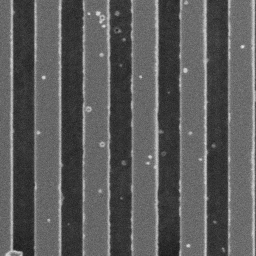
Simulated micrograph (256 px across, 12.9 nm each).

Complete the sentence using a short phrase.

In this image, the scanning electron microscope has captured lines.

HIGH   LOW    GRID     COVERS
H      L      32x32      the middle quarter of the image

LLLLLHHHHHHLLLLLLHHHHHHLLLLLLHHH
LLLLLHHHHHHLLLLLLHHHHHHLLLLLLHHH
LLLLLHHHHHHLLLLLLHHHHHHLLLLLLHHH
LLLLLHHHHHHLLLLLLHHHHHHLLLLLLHHH
LLLLLHHHHHHLLLLLLHHHHHHLLLLLLHHH
LLLLLHHHHHHLLLLLLHHHHHHLLLLLLHHH
LLLLLHHHHHHLLLLLLHHHHHHLLLLLLHHH
LLLLLHHHHHHLLLLLLHHHHHHLLLLLLHHH
LLLLLHHHHHHLLLLLLHHHHHHLLLLLLHHH
LLLLLHHHHHHLLLLLLHHHHHHLLLLLLHHH
LLLLLHHHHHHLLLLLLHHHHHHLLLLLLHHH
LLLLLHHHHHHLLLLLLHHHHHHLLLLLLHHH
LLLLLHHHHHHLLLLLLHHHHHHLLLLLLHHH
LLLLLHHHHHHLLLLLLHHHHHHLLLLLLHHH
LLLLLHHHHHHLLLLLLHHHHHHLLLLLLHHH
LLLLLHHHHHHLLLLLLHHHHHHLLLLLLHHH
LLLLLHHHHHHLLLLLLHHHHHHLLLLLLHHH
LLLLLHHHHHHLLLLLLHHHHHHLLLLLLHHH
LLLLLHHHHHHLLLLLLHHHHHHLLLLLLHHH
LLLLLHHHHHHLLLLLLHHHHHHLLLLLLHHH
LLLLLHHHHHHLLLLLLHHHHHHLLLLLLHHH
LLLLLHHHHHHLLLLLLHHHHHHLLLLLLHHH
LLLLLHHHHHHLLLLLLHHHHHHLLLLLLHHH
LLLLLHHHHHHLLLLLLHHHHHHLLLLLLHHH
LLLLLHHHHHHLLLLLLHHHHHHLLLLLLHHH
LLLLLHHHHHHLLLLLLHHHHHHLLLLLLHHH
LLLLLHHHHHHLLLLLLHHHHHHLLLLLLHHH
LLLLLHHHHHHLLLLLLHHHHHHLLLLLLHHH
LLLLLHHHHHHLLLLLLHHHHHHLLLLLLHHH
LLLLLHHHHHHLLLLLLHHHHHHLLLLLLHHH
LLLLLHHHHHHLLLLLLHHHHHHLLLLLLHHH
LLLLLHHHHHHLLLLLLHHHHHHLLLLLLHHH